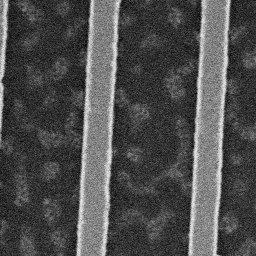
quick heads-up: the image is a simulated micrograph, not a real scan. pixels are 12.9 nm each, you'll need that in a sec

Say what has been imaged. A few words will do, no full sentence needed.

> one or a few lines or trenches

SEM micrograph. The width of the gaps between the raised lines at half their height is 1110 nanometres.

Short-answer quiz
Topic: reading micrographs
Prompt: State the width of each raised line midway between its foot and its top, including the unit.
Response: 321 nanometers